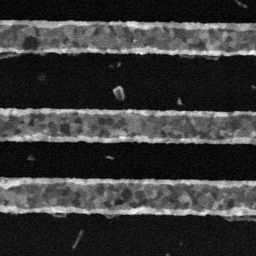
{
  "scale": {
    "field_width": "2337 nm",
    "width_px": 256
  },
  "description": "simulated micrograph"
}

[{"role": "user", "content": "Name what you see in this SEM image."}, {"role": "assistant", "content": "lines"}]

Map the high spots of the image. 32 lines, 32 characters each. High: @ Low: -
--------------------------------
--------------------------------
--------------------------------
@@@@@@@@@@@@@@@@@@@@@@@@@@@@@@@@
@@@@@@@@@@@@@@@@@@@@@@@@@@@@@@@@
@@@@@@@@@@@@@@@@@@@@@@@@@@@@@@@@
--------------------@@@@@@@@@@@@
--------------------------------
--------------------------------
--------------------------------
--------------------------------
--------------------------------
--------------------------------
--------------------------------
@@@@@@@@@@@@@@@@@@@@@@@@@@@@@@@@
@@@@@@@@@@@@@@@@@@@@@@@@@@@@@@@@
@@@@@@@@@@@@@@@@@@@@@@@@@@@@@@@@
------------@@@----@@@@@@@@@@@@@
--------------------------------
--------------------------------
--------------------------------
--------------------------------
--------------------------------
@@@@@@@@@@@@@@@@@@@@@@@@@@@@@@@@
@@@@@@@@@@@@@@@@@@@@@@@@@@@@@@@@
@@@@@@@@@@@@@@@@@@@@@@@@@@@@@@@@
----------@@@@@@@--@@@@@@@@@@@@@
--------------------------------
--------------------------------
--------------------------------
--------------------------------
--------------------------------